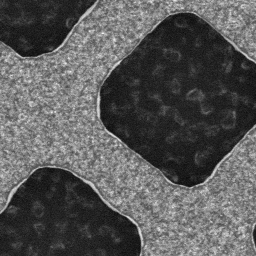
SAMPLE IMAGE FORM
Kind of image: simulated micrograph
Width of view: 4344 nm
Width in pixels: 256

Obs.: holes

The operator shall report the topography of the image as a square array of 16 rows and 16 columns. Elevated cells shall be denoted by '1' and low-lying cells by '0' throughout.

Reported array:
0000001111111111
0000011111000111
0000111110000011
1011111100000001
1111111000000000
1111110000000000
1111110000000000
1111110000000000
1111111000000001
1111111100000011
1110111111000111
1000001111100111
1000001111111111
0000000011111111
0000000001111111
0000000001111111